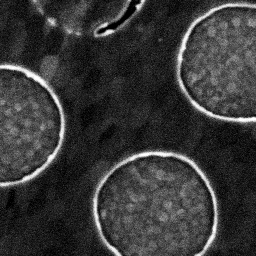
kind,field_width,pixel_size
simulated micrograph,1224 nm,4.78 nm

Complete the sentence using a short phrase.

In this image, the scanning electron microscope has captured holes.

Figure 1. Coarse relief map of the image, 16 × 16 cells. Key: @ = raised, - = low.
@@@@@@@@@@@@@@--
@@@@@@@@@@@@----
@@@@@@@@@@@@----
@@@@@@@@@@@-----
-@@@@@@@@@@-----
---@@@@@@@@@----
----@@@@@@@@----
----@@@@@@@@@@@@
----@@@@@@@@@@@@
---@@@@@@@@@@@@@
--@@@@@-----@@@@
@@@@@@-------@@@
@@@@@@-------@@@
@@@@@@-------@@@
@@@@@@-------@@@
@@@@@@@------@@@